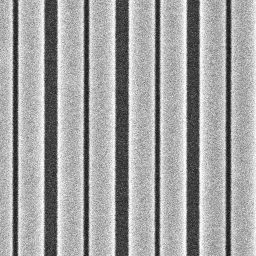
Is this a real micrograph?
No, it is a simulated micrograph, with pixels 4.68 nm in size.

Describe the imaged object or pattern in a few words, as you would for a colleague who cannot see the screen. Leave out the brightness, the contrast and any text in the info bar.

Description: parallel lines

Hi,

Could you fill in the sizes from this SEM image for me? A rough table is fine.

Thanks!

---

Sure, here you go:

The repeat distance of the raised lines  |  36.4 px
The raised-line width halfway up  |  25.3 px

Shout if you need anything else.